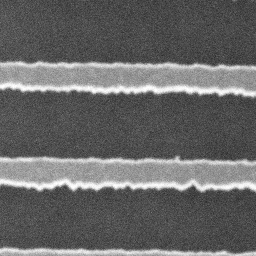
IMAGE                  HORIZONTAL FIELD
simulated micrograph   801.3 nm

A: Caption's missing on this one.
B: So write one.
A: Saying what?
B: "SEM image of lines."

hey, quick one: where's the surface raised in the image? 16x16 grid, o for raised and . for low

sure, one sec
................
................
................
................
oooooooooooooooo
.ooooooooooooooo
................
................
................
................
oooooooooooooooo
oooooooooooooooo
................
................
................
................